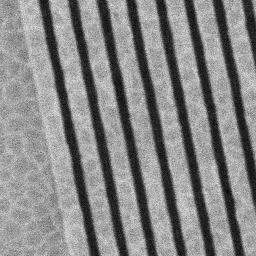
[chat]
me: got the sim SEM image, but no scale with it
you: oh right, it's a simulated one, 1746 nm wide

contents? parallel lines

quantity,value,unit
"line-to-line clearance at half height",59.3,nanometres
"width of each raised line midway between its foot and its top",19.2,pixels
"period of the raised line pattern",0.194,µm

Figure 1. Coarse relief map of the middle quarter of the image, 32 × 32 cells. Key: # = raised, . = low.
####...####...#####..#####..####
####...#####..#####..#####...###
#####..#####..#####..#####...###
#####..#####...####...#####..###
#####...####...#####..#####..###
#####...#####..#####..#####..###
.#####..#####..#####..#####...##
.#####..#####..#####...####...##
.#####..#####..#####...#####..##
.#####..#####...#####..#####..##
.#####...#####..#####..#####..##
.######..#####..#####..#####...#
..#####..#####..#####...####...#
..#####..#####..######..#####..#
..#####..#####..######..#####..#
..#####...#####..#####..#####..#
...#####..#####..#####..#####...
...#####..#####..#####...####...
...#####..#####..######..#####..
#..#####...####...#####..#####..
#..#####...#####..#####..#####..
#...####...#####..#####..#####..
##..#####..#####..#####...####..
##..#####..#####..######..#####.
##..#####...####...#####..#####.
##..#####...#####..#####..#####.
##...#####..#####..#####..#####.
##...#####..#####..#####...####.
###..#####..#####...#####..#####
###..#####...#####..#####..#####
###..#####...#####..#####..#####
###..######..#####..#####..#####